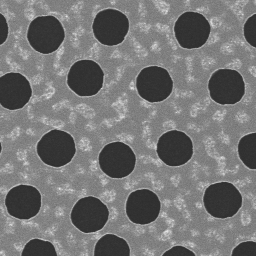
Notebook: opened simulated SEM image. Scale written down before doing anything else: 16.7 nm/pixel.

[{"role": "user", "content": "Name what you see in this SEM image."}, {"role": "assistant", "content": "a regular array of holes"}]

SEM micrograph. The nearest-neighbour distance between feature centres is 989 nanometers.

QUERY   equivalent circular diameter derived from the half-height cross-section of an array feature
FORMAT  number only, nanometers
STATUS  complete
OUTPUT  616